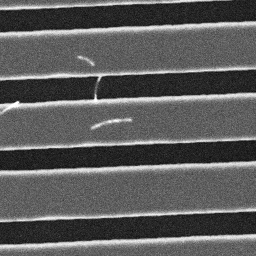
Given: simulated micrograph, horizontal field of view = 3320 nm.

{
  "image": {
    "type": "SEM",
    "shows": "lines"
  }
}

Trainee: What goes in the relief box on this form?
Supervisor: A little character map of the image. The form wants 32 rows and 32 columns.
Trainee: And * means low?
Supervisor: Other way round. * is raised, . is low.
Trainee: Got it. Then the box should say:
****************................
................................
................................
..............******************
********************************
********************************
********************************
********************************
********************************
**********......................
................................
................................
...........*.*******************
********************************
********************************
********************************
********************************
******************************..
******..........................
................................
.......................*********
********************************
********************************
********************************
********************************
********************************
*****************************...
****............................
................................
............................****
......**************************
********************************